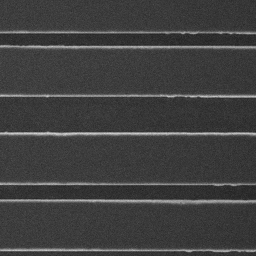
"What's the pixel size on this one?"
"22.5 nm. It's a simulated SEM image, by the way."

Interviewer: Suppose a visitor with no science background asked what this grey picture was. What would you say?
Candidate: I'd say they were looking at lines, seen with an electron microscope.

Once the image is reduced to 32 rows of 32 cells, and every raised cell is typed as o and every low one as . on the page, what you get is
oooooooooooooooooooooooooooooooo
oooooooooooooooooooooooooooooooo
oooooooooooooooooooooooooooooooo
oooooooooooooooooooooooooooooooo
................................
................................
oooooooooooooooooooooooooooooooo
oooooooooooooooooooooooooooooooo
oooooooooooooooooooooooooooooooo
oooooooooooooooooooooooooooooooo
oooooooooooooooooooooooooooooooo
oooooooooooooooooooooooooooooooo
................................
................................
................................
................................
................................
oooooooooooooooooooooooooooooooo
oooooooooooooooooooooooooooooooo
oooooooooooooooooooooooooooooooo
oooooooooooooooooooooooooooooooo
oooooooooooooooooooooooooooooooo
oooooooooooooooooooooooooooooooo
................................
................................
oooooooooooooooooooooooooooooooo
oooooooooooooooooooooooooooooooo
oooooooooooooooooooooooooooooooo
oooooooooooooooooooooooooooooooo
oooooooooooooooooooooooooooooooo
oooooooooooooooooooooooooooooooo
................................